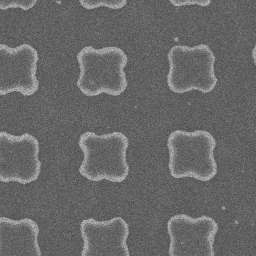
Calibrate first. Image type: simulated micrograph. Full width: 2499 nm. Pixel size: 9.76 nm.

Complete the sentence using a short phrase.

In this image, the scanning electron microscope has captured raised bodies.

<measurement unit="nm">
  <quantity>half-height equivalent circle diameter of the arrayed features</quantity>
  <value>478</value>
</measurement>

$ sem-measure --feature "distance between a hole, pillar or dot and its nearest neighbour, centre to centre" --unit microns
0.837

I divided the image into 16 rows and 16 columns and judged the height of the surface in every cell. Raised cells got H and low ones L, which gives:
LHLLLLLLLLLLLLLL
LLLLLLLLLLLLLLLL
LLLLLLLLLLLLLLLL
HHLLLHHHLLLHHLLL
HHLLLHHHLLLHHLLL
HHLLLHHHLLLHHLLL
LLLLLLLLLLLLLLLL
LLLLLLLLLLLLLLLL
HLLLLHHLLLLHHLLL
HHLLLHHHLLLHHLLL
HHLLLHHHLLLHHLLL
LLLLLLLLLLLLLLLL
LLLLLLLLLLLLLLLL
LLLLLLLLLLLLLLLL
HHLLLHHHLLLHHLLL
HHLLLHHHLLLHHLLL